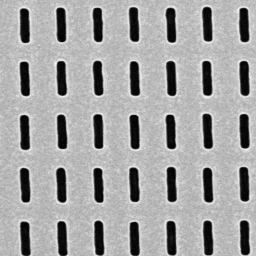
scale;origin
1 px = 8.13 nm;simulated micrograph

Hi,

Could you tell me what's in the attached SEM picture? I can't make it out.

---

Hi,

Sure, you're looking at a regular array of holes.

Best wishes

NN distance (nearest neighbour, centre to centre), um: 0.295